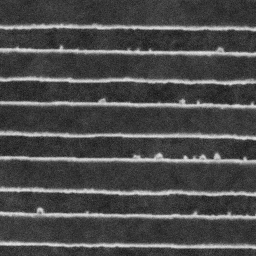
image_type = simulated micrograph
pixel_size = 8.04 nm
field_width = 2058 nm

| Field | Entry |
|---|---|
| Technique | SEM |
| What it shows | lines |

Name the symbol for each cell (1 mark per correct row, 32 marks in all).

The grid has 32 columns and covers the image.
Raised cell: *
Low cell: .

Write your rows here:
********************************
********************************
********************************
......................**********
................................
................................
********************............
********************************
********************************
********************************
................................
................................
................................
********************************
********************************
********************************
********************************
................................
................................
................................
********************************
********************************
********************************
********************************
................................
................................
................................
********************************
********************************
********************************
.*******************************
................................